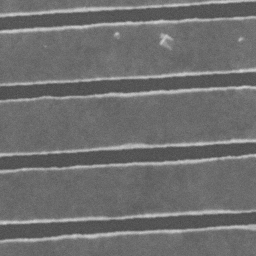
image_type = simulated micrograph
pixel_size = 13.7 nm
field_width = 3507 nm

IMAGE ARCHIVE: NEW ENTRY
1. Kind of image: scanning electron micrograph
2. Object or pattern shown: lines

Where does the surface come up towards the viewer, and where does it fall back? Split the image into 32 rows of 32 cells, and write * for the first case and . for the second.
************************........
*******.........................
........................*.******
........************************
********************************
********************************
********************************
********************************
********************************
*********************...........
**..............................
.....................***********
..******************************
********************************
********************************
********************************
********************************
********************************
***************.................
...............................*
................****************
********************************
********************************
********************************
********************************
********************************
**************************......
********........................
...........................*****
.........*..********************
********************************
********************************